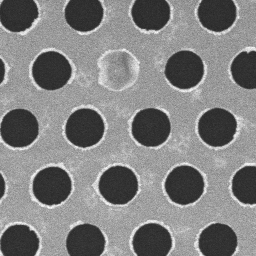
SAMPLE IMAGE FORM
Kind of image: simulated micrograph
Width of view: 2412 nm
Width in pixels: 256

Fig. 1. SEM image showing a regular array of holes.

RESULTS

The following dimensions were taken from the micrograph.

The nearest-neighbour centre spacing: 66.1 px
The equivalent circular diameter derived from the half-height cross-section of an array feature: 370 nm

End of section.